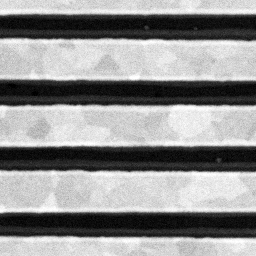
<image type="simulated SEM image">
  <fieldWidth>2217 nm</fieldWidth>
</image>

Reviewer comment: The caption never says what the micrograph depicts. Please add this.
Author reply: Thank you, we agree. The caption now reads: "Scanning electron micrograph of lines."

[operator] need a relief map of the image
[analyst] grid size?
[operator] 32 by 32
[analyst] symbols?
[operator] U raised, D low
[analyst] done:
UUUUUUUUUUUUUUUUUUUUUUUUUUUUUUUU
UUUUUUUUUUUUUUUUUUUUUUUUUUUUUUUU
DDDDDDDDDDDDDDDDDDDDDDDDDDDDDDDD
DDDDDDDDDDDDDDDDDDDDDDDDDDDDDDDD
DDDDDDDDDDDDDDDDDDDDDDDDDDDDDDDD
UUUUUUUUUUUUUUUUUUUUUUUUUUUUUUUU
UUUUUUUUUUUUUUUUUUUUUUUUUUUUUUUU
UUUUUUUUUUUUUUUUUUUUUUUUUUUUUUUU
UUUUUUUUUUUUUUUUUUUUUUUUUUUUUUUU
UUUUUUUUUUUUUUUUUUUUUUUUUUUUUUUU
DDDDDDDDDDDDDDDDDDDDDDDDDDDDDDDD
DDDDDDDDDDDDDDDDDDDDDDDDDDDDDDDD
DDDDDDDDDDDDDDDDDDDDDDDDDDDDDDDD
UUUUUUUUUUUUUUUUUUUUUUUUUUUUUUUU
UUUUUUUUUUUUUUUUUUUUUUUUUUUUUUUU
UUUUUUUUUUUUUUUUUUUUUUUUUUUUUUUU
UUUUUUUUUUUUUUUUUUUUUUUUUUUUUUUU
UUUUUUUUUUUUUUUUUUUUUUUUUUUUUUUU
DDDDDDDDDDDDDDDDDDDDDDDDDDDDDDDD
DDDDDDDDDDDDDDDDDDDDDDDDDDDDDDDD
DDDDDDDDDDDDDDDDDDDDDDDDDDDDDDDD
UUUUUUUUUUUDUUUUUDUUUUUUUDDDDDDD
UUUUUUUUUUUUUUUUUUUUUUUUUUUUUUUU
UUUUUUUUUUUUUUUUUUUUUUUUUUUUUUUU
UUUUUUUUUUUUUUUUUUUUUUUUUUUUUUUU
UUUUUUUUUUUUUUUUUUUUUUUUUUUUUUUU
DDDDDDDDDDDDDDDDDDDDDDDDDDDDDDDD
DDDDDDDDDDDDDDDDDDDDDDDDDDDDDDDD
DDDDDDDDDDDDDDDDDDDDDDDDDDDDDDDD
DDDDDDDDDDDDDDDDDDDDDDDDDDDDDDDD
UUUUUUUUUUUUUUUUUUUUUUUUUUUUUUUU
UUUUUUUUUUUUUUUUUUUUUUUUUUUUUUUU